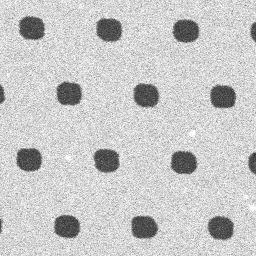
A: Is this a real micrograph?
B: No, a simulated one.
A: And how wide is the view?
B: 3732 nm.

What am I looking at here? a regular array of holes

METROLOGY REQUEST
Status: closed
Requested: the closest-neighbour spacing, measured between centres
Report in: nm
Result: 1100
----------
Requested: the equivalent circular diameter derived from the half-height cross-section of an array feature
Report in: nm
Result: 381